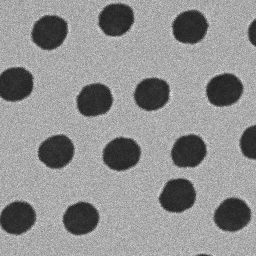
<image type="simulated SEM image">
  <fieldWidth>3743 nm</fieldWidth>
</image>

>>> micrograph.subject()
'a regular array of holes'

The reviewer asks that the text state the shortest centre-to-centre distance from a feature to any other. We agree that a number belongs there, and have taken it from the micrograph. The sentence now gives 0.908 microns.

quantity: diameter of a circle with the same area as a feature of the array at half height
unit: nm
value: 524